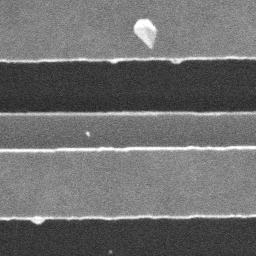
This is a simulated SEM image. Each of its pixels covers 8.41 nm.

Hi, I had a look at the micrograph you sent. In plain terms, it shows lines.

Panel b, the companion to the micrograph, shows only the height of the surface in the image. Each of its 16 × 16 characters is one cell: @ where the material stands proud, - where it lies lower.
@@@@@@@@@@@@@@@@
@@@@@@@@@@@@@@@@
@@@@@@@@@@@@@@@@
@@@@@@@@@@@@@@@@
----------------
----------------
----------------
@@@@@@@@@@@@@@@@
@@@@@@@@@@@@@@@@
@@@@@@@@@@@@@@@@
@@@@@@@@@@@@@@@@
@@@@@@@@@@@@@@@@
@@@@@@@@@@@@@@@@
@@@@@@@@@@@@@@@@
----------------
----------------